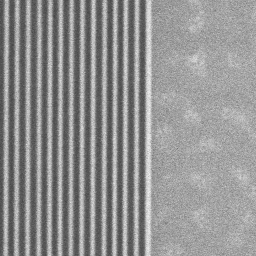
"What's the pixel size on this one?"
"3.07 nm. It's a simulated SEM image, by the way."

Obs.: parallel lines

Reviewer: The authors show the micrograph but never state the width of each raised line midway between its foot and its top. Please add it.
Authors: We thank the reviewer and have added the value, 15 nanometers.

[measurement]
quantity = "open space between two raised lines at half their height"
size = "18.1 nanometers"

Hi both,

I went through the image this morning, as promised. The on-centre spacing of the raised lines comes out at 33.5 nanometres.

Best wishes